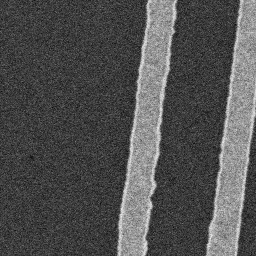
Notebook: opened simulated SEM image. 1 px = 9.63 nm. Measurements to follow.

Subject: one or a few lines or trenches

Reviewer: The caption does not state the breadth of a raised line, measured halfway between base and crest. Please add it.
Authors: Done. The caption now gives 250 nm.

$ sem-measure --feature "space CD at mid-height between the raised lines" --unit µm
0.629